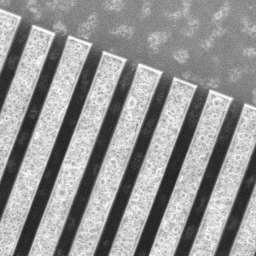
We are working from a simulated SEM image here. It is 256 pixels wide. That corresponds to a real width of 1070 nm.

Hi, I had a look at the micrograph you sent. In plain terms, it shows parallel lines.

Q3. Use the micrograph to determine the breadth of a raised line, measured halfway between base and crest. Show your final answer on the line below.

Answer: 96.8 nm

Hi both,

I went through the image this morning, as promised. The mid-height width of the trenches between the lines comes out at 59.7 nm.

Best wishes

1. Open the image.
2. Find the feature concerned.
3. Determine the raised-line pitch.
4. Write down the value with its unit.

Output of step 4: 155 nm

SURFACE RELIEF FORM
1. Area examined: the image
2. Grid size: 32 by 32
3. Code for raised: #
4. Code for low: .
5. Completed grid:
................................
#...............................
##..............................
##..#...........................
##..###.........................
#..###..###.....................
#..###..###.....................
#..###..###..##.................
..###..###..###..##.............
..###..###..###..###............
.###..###...###..###..##........
.###..###..###..###..###........
.###..###..###..###..###..###...
###..###..###..###..###...##...#
###..###..###..###..###..###..##
###..###..###..###..###..###..##
##..###..###..###..###..###..###
##..###..###..###..###..###..###
##.####..###..###..###..###..###
#..###..###..###..###..###..###.
#..###..###..###..###..###..###.
..###..####.####.####..###..###.
..###..###..###..###..###..###..
..###..###..###..###..###..###..
.###..###..###..###..###..####.#
.###..###..###..###..###..###..#
####..###..###..###..###..###..#
###..###..###..###..###..###..##
###..###..###..###..###..###..##
##..####.####.####.####..###..##
##..###..###..###..###..###..###
##..###..###..###..###..###..###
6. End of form